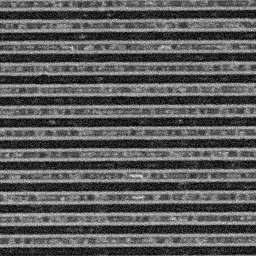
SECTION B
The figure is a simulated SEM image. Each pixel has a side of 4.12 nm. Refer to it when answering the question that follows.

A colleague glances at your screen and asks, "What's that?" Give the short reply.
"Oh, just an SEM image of parallel lines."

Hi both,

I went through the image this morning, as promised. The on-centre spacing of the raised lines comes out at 88.7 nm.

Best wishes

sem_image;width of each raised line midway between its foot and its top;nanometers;42.8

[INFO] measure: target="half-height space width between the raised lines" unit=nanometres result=46.9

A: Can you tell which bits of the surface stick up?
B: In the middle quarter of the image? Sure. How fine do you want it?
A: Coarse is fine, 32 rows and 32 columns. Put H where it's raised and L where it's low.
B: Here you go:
HHHHHHHHHHHHHHHHHHHHHHHHHHHHHHHH
HHHHHHHHHHHHHHHHHHHHHHHHHHHHHHHH
LLLLLLLLLLLLLLLLLLLLLLLLLLLLLLLL
LLLLLLLLLLLLLLLLLLLLLLLLLLLLLLLL
LLLLLLLLLLLLLLLLLLLLLLLLLLLLLLLL
LLLLLHHHHHHHHHHHHHHHHHHHHHHHHHHH
HHHHHHHHHHHHHHHHHHHHHHHHHHHHHHHH
HHHHHHHHHHHHHHHHHHHHHHHHHHHHHHLL
LLLLLLLLLLLLLLLLLLLLLLLLLLLLLLLL
LLLLLLLLLLLLLLLLLLLLLLLLLLLLLLLL
LLLLLLLLLLLLLLLLLLLLLLLLLLLLLLLL
HHHHHHHHHHHHHHHHHHHHHHHHHHHHHHHH
HHHHHHHHHHHHHHHHHHHHHHHHHHHHHHHH
LLLLLLLLLLLLLLLLLLLLLLLLLLLLLLLL
LLLLLLLLLLLLLLLLLLLLLLLLLLLLLLLL
LLLLLLLLLLLLLLLLLLLLLLLLLLLLLLLL
HHHHHHHHHHHHHHHHHHHHHHHHHHHHHHHH
HHHHHHHHHHHHHHHHHHHHHHHHHHHHHHHH
HHHHHHHHHHHLLLLLLLLLLLLLLLLLLLLL
LLLLLLLLLLLLLLLLLLLLLLLLLLLLLLLL
LLLLLLLLLLLLLLLLLLLLLLLLLLLLLLLL
LHHHHHHHHHHHLLLLLLHHHLLLLLLLLHHH
HHHHHHHHHHHHHHHHHHHHHHHHHHHHHHHH
HHHHHHHHHHHHHHHHHHHHHHHHHHHHHHHH
LLLLLLLLLLLLLLLLLLLLLLLLLLLLLLLL
LLLLLLLLLLLLLLLLLLLLLLLLLLLLLLLL
LLLLLLLLLLLLLLLLLLLLLLLLLLLLLLLL
HHHHHHHHHHHHHHHHHHHHHHHHHHHHHHHH
HHHHHHHHHHHHHHHHHHHHHHHHHHHHHHHH
LLLLLLLLLLLLLLLLLLLLLLLLLLLLLLLL
LLLLLLLLLLLLLLLLLLLLLLLLLLLLLLLL
LLLLLLLLLLLLLLLLLLLLLLLLLLLLLLLL